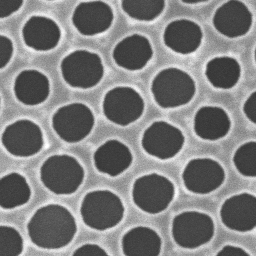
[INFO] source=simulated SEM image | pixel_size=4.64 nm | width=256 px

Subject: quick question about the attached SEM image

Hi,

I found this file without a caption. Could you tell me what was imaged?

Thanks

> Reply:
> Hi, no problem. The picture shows a regular array of holes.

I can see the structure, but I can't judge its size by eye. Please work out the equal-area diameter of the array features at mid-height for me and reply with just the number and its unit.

0.184 um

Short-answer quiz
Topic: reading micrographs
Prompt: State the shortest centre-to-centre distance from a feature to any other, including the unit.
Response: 0.244 µm